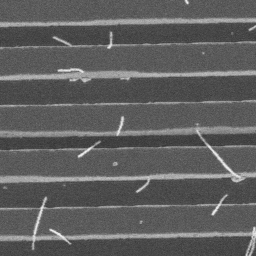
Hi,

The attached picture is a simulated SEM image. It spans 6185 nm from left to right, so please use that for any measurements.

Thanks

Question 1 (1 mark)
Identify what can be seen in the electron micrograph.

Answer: lines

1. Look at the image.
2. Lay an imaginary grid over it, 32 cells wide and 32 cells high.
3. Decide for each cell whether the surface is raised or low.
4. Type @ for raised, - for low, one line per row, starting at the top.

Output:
@@@@@@@@@@@@@@@@@@@@@@@@@@@@@@@@
@@@@@@@@@@@@@@@@@@@@@@@@@@@@@@@@
@@@@@@@@@@@@@@@@@@@@@@@@@@@@@@@@
--------------------------------
--------------------------------
------------------------@@@@@@@@
@@@@@@@@@@@@@@@@@@@@@@@@@@@@@@@@
@@@@@@@@@@@@@@@@@@@@@@@@@@@@@@@@
@@@@@@@@@@@@@@@@@@@@@@@@@@@@@@@@
@@@@@@@@------------------------
--------------------------------
--------------------------------
--------------------------------
@@@@@@@@@@@@@@@@@@@@@@@@@@@@@@@@
@@@@@@@@@@@@@@@@@@@@@@@@@@@@@@@@
@@@@@@@@@@@@@@@@@@@@@@@@@@@@@@@@
@@@@@@@@@@@@@@@@@@@@@@----------
--------------------------------
-----------@--------@@@@@@@@@@@@
@@@@@@@@@@@@@@@@@@@@@@@@@@@@@@@@
@@@@@@@@@@@@@@@@@@@@@@@@@@@@@@@@
@@@@@@@@@@@@@@@@@@@@@@@@@@@@@@@@
--------------------------------
--------------------------------
--------------------------------
---------------------------@--@@
@@@@@@@@@@@@@@@@@@@@@@@@@@@@@@@@
@@@@@@@@@@@@@@@@@@@@@@@@@@@@@@@@
@@@@@@@@@@@@@@@@@@@@@@@@@@@@@@@@
@@@@@@@@@@@@@@@@@--------------@
--------------------------------
--------------------------------